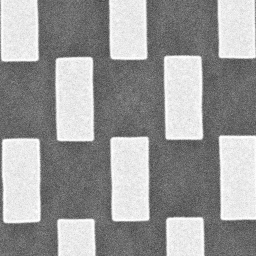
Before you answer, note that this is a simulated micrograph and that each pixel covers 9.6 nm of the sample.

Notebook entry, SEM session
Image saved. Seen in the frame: groups of lines, slits or small figures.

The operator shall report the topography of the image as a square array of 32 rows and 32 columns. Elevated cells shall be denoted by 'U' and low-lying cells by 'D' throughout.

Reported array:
UUUUUDDDDDDDDDUUUUDDDDDDDDDUUUUU
UUUUUDDDDDDDDDUUUUDDDDDDDDDUUUUU
UUUUUDDDDDDDDDUUUUDDDDDDDDDUUUUU
UUUUUDDDDDDDDDUUUUDDDDDDDDDUUUUU
UUUUUDDDDDDDDDUUUUDDDDDDDDDUUUUU
UUUUUDDDDDDDDDUUUUDDDDDDDDDUUUUU
UUUUUDDDDDDDDDUUUUDDDDDDDDDUUUUU
UUUUDDDUUUUDDDDDDDDDDUUUUDDDDDDD
DDDDDDDUUUUUDDDDDDDDDUUUUDDDDDDD
DDDDDDDUUUUUDDDDDDDDDUUUUDDDDDDD
DDDDDDDUUUUUDDDDDDDDDUUUUDDDDDDD
DDDDDDDUUUUUDDDDDDDDDUUUUDDDDDDD
DDDDDDDUUUUUDDDDDDDDDUUUUDDDDDDD
DDDDDDDUUUUUDDDDDDDDDUUUUDDDDDDD
DDDDDDDUUUUUDDDDDDDDDUUUUDDDDDDD
DDDDDDDUUUUUDDDDDDDDDUUUUDDDDDDD
DDDDDDDUUUUUDDDDDDDDDUUUUDDDDDDD
DUUUUDDDUUUDDDUUUUDDDDDDDDDDUUUU
UUUUUDDDDDDDDDUUUUDDDDDDDDDDUUUU
UUUUUDDDDDDDDDUUUUDDDDDDDDDDUUUU
UUUUUDDDDDDDDDUUUUDDDDDDDDDDUUUU
UUUUUDDDDDDDDDUUUUDDDDDDDDDDUUUU
UUUUUDDDDDDDDDUUUUDDDDDDDDDDUUUU
UUUUUDDDDDDDDDUUUUDDDDDDDDDDUUUU
UUUUUDDDDDDDDDUUUUDDDDDDDDDDUUUU
UUUUUDDDDDDDDDUUUUDDDDDDDDDDUUUU
UUUUUDDDDDDDDDUUUUUDDDDDDDDDUUUU
DUUUUDDDUUUDDDDUUDDDDUUUUDDDDDDD
DDDDDDDUUUUUDDDDDDDDDUUUUDDDDDDD
DDDDDDDUUUUUDDDDDDDDDUUUUDDDDDDD
DDDDDDDUUUUUDDDDDDDDDUUUUDDDDDDD
DDDDDDDUUUUUDDDDDDDDDUUUUDDDDDDD